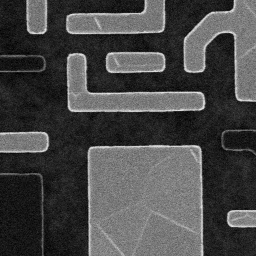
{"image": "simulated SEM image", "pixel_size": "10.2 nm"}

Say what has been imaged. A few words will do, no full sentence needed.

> wiring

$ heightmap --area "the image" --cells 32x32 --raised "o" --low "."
...ooo............oo.........ooo
...ooo............ooo.......oooo
...ooo..ooooooooooooo....ooooooo
....oo..oooooooooooo....oooooooo
.......................oooo..ooo
.......................ooo...ooo
.......................ooo...ooo
oooooo..ooo..oooooooo..ooo...ooo
oooooo..ooo..oooooooo..ooo...ooo
........ooo..................ooo
........ooo..................ooo
.........oo..................ooo
.........ooooooooooooooooo....oo
.........oooooooooooooooo.......
................................
................................
............................oooo
oooooo......................oooo
oooooo.....oooooooooooooo...oooo
...........oooooooooooooo.......
...........oooooooooooooo.......
...........oooooooooooooo.......
ooooo......oooooooooooooo.......
ooooo......oooooooooooooo.......
ooooo......oooooooooooooo.......
ooooo......oooooooooooooo.......
ooooo......oooooooooooooo....ooo
ooooo......oooooooooooooo....ooo
ooooo......oooooooooooooo.......
ooooo......oooooooooooooo.......
ooooo......oooooooooooooo.......
ooooo......oooooooooooooo.......